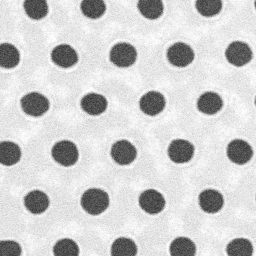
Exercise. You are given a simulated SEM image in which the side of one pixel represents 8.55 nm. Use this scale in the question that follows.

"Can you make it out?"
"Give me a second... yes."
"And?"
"a regular array of holes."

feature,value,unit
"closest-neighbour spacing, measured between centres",482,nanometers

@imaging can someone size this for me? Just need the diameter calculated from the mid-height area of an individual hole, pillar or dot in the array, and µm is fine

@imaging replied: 0.239